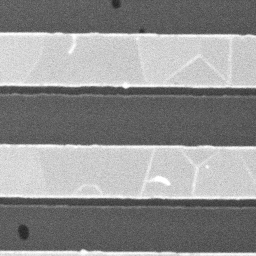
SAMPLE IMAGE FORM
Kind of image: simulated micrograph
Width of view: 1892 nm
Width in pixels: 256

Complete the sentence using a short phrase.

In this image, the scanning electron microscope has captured lines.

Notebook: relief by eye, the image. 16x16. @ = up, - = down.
----------------
----------------
@@@@@@@@@@@@@@@@
@@@@@@@@@@@@@@@@
@@@@@@@@@@@@@@@@
----------------
----------------
----------------
----------------
@@@@@@@@@@@@@@@@
@@@@@@@@@@@@@@@@
@@@@@@@@@@@@@@@@
----------------
----------------
----------------
----------------